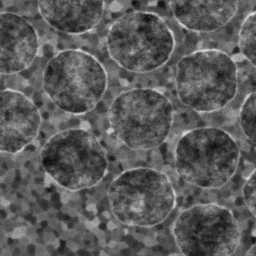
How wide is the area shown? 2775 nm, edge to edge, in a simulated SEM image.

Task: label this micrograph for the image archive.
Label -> holes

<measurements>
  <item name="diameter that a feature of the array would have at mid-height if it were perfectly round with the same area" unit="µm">0.654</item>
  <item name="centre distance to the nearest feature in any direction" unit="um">0.824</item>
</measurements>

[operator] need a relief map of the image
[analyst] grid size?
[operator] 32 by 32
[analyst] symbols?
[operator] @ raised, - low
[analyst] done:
@@@@@--------@@@@@@@@---------@@
@@@@@--------@@@@@@@@@-------@@@
---@@@------@@@-----@@-------@@-
----@@@----@@@-------@@----@@@--
-----@@@@@@@@--------@@@@@@@@@--
-----@@@@@@@@---------@@@@@@@@--
-----@@@--@@@@-------@@@@--@@@--
----@@------@@-------@@------@@-
---@@@-------@@@----@@--------@@
@@@@@--------@@@@@@@@@--------@@
@@@@@--------@@@@@@@@@--------@@
--@@@--------@@@----@@-------@@@
----@@-------@-------@@------@@-
-----@@-----@@--------@@----@@--
-----@@@@@@@@@--------@@@@@@@@--
-----@@@@@@@@@-------@@@@@@@@@--
-----@@@---@@@-------@@@----@@@-
----@@------@@@------@@------@@-
---@@--------@@@---@@@--------@@
@@@@@--------@@@@@@@@@--------@@
@@@@@--------@@@@@@@@@--------@@
@@@@@@-------@@@----@@-------@@@
@@@@@@@-----@@-------@@-----@@@-
@@@@@@@@--@@@@-------@@@@@-@@@--
@@@@@@@@@@@@@---------@@@@@@@@--
@@@@@@@@@@@@@@--------@@@@@@@@@-
@@@@@@@@@@@@@@-------@@------@@-
@@@@@@@@@@@@@@@-----@@-------@@@
@@@@@@@@@@@@@@@@@@@@@@--------@@
@@@@@@@@@@@@@@@@@@@@@@--------@@
@@@@@@@@@@@@@@@@@@@@@@--------@@
@@@@@@@@@@@@@@@@@@@@@@@------@@-